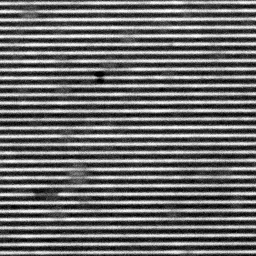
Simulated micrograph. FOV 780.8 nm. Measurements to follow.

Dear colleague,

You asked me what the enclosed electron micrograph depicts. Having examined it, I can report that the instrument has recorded parallel lines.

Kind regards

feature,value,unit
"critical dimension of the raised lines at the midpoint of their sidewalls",0.0042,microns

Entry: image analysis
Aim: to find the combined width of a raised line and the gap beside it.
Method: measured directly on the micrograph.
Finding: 25.3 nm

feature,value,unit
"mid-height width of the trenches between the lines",21.3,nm